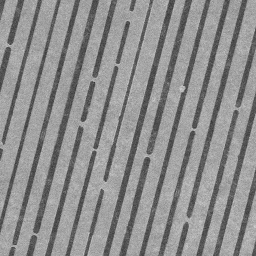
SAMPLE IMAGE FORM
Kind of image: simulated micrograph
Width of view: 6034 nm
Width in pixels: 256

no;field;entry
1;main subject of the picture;parallel lines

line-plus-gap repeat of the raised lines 426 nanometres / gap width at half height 128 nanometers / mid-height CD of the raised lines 305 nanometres